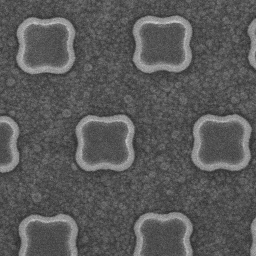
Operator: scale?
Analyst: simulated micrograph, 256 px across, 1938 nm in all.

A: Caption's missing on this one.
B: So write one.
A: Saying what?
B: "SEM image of raised bodies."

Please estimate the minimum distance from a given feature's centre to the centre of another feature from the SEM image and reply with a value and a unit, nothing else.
866 nm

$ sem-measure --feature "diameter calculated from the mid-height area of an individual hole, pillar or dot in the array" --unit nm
425